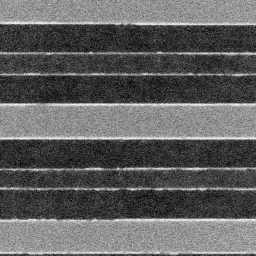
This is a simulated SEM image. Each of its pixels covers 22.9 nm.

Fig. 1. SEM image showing lines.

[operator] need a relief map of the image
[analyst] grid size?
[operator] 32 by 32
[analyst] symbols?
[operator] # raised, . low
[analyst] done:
################################
################################
################################
................................
................................
................................
................................
################################
################################
................................
................................
................................
................................
################################
################################
################################
################################
................................
................................
................................
................................
################################
################################
################################
................................
................................
................................
.######....#..##################
################################
################################
################################
################################